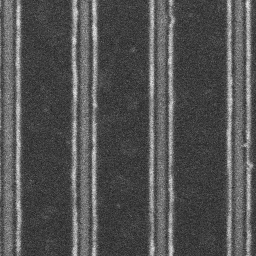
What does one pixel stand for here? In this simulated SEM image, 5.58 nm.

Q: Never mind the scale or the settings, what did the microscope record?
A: one or a few lines or trenches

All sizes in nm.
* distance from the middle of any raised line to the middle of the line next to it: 429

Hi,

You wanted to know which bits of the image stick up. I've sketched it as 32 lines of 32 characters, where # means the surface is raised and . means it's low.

..########..#######..########..#
..########..#######..########..#
..########..#######..########..#
..########..#######..########..#
..#######...#######..########..#
..#######...#######..########..#
..#######...#######..########..#
..#######...#######..########..#
..#######...#######..########..#
..########..#######..########..#
..########..#######..########..#
..########..#######..########..#
..########..#######..########..#
..#######...#######..########..#
..#######...#######..########..#
..#######...#######..########..#
..########..#######..########..#
..#######...#######..########..#
..#######...#######..########..#
..#######...#######..########..#
..#######...#######..########..#
..#######...#######..########..#
..#######...#######..########..#
..#######...#######..########..#
..#######...#######..########..#
..#######...#######..########..#
..########..#######..########..#
..########..#######..########..#
..########..#######..########..#
..########..#######..########..#
..########..#######..########..#
..########..#######..########..#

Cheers